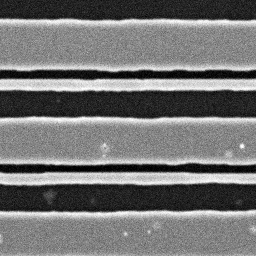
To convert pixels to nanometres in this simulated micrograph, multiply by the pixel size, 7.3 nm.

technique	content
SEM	lines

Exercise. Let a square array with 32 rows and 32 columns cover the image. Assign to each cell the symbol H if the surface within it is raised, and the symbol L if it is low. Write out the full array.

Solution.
LLLLLLLLLLLLLLLLLLLLLLLLLLLLLLLL
LLLLLLLLLLLLLLLLLLLLLLLLLLLLLLLL
LLLLLLLLLLLLLLLLLLLLLLLLLLLLLLLL
HHHHHHHHHHHHHHHHHHHHHHHHHHHHHHHH
HHHHHHHHHHHHHHHHHHHHHHHHHHHHHHHH
HHHHHHHHHHHHHHHHHHHHHHHHHHHHHHHH
HHHHHHHHHHHHHHHHHHHHHHHHHHHHHHHH
HHHHHHHHHHHHHHHHHHHHHHHHHHHHHHHH
HHHHHHHHHHHHHHHHHHHHHHHHHHHHHHHH
HHHHHHHHHHHHHHHHHHHHHHHHHHHHHHHH
HHHHHHHHHHHHHHHHHHHHHHHHHHHHHHHH
LLLLLLLLLLLLLLLLLLLLLLLLLLLLLLLL
LLLLLLLLLLLLLLLLLLLLLLLLLLLLLLLL
LLLLLLLLLLLLLLLLLLLLLLLLLLLLLLLL
LLLLLLLLLLLLLLLLLLLLLLLLLLLLLLLL
HHHHHHHHHHHHHHHHHHHHHHHHHHHHHHHH
HHHHHHHHHHHHHHHHHHHHHHHHHHHHHHHH
HHHHHHHHHHHHHHHHHHHHHHHHHHHHHHHH
HHHHHHHHHHHHHHHHHHHHHHHHHHHHHHHH
HHHHHHHHHHHHHHHHHHHHHHHHHHHHHHHH
HHHHHHHHHHHHHHHHHHHHHHHHHHHHHHHH
HHHHHHHHHHHHHHHHHHHHHHHHHHHHHHHH
HHHHHHHHHHHHHHHHHHHHHHHHHHHHHHHH
LLLLLLLLLLLLLLLLLLLLLLLLLLLLLLLL
LLLLLLLLLLLLLLLLLLLLLLLLLLLLLLLL
LLLLLLLLLLLLLLLLLLLLLLLLLLLLLLLL
LLLLLLLLLLLLLLHHHLHHHHLHHHHHHHHH
HHHHHHHHHHHHHHHHHHHHHHHHHHHHHHHH
HHHHHHHHHHHHHHHHHHHHHHHHHHHHHHHH
HHHHHHHHHHHHHHHHHHHHHHHHHHHHHHHH
HHHHHHHHHHHHHHHHHHHHHHHHHHHHHHHH
HHHHHHHHHHHHHHHHHHHHHHHHHHHHHHHH